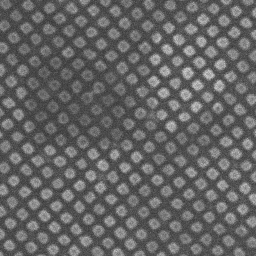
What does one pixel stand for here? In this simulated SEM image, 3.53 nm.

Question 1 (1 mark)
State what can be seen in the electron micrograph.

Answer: a regular array of raised bodies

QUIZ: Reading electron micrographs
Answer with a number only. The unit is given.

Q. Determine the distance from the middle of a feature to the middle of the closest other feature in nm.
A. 52.9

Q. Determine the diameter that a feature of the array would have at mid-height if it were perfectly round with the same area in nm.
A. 34